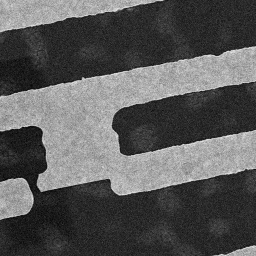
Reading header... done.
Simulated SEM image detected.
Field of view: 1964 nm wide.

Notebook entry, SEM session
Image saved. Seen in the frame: one or a few lines or trenches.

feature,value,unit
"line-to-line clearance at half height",471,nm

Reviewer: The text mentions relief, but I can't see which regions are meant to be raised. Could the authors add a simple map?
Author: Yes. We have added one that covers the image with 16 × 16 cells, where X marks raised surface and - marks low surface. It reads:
XXXXXXXX--------
XXX-------------
----------------
-------------XXX
--------XXXXXXXX
---XXXXXXXXXX---
XXXXXXXXX-------
XXXXXXX---------
---XXXX-------XX
---XXXXX-XXXXXXX
---XXXXXXXXXXXXX
XXXXX--XXXX-----
XX--------------
X---------------
----------------
---------------X